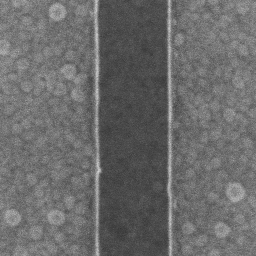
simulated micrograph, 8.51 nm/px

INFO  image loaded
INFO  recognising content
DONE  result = one or a few lines or trenches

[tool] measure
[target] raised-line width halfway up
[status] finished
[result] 616 nanometres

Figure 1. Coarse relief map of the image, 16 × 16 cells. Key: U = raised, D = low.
DDDDDDUUUUUDDDDD
DDDDDDUUUUUDDDDD
DDDDDDUUUUUDDDDD
DDDDDDUUUUUDDDDD
DDDDDDUUUUUDDDDD
DDDDDDUUUUUDDDDD
DDDDDDUUUUUDDDDD
DDDDDDUUUUUDDDDD
DDDDDDUUUUUDDDDD
DDDDDDUUUUUDDDDD
DDDDDDUUUUUDDDDD
DDDDDDUUUUUDDDDD
DDDDDDUUUUUDDDDD
DDDDDDUUUUUDDDDD
DDDDDDUUUUUDDDDD
DDDDDDUUUUUDDDDD